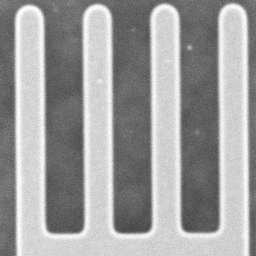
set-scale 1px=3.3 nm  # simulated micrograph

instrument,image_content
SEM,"groups of lines, slits or small figures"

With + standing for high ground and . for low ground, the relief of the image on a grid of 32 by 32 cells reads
................................
..+++......+++.....+++......+++.
..+++......+++.....+++.....++++.
..+++......+++.....+++.....++++.
..+++......+++.....+++.....++++.
..+++......+++.....+++.....++++.
..+++......+++.....+++.....++++.
..+++......+++.....+++......+++.
..+++......+++.....+++......+++.
..+++......+++.....+++......+++.
..+++......+++.....+++......+++.
..+++......+++.....+++......+++.
..+++......+++.....+++......+++.
..+++......+++.....+++......+++.
..+++......+++.....+++......+++.
..+++......+++.....+++......+++.
..+++......+++.....+++......+++.
..++++.....+++.....+++......+++.
..++++.....+++.....+++......+++.
..++++.....+++.....+++......+++.
..++++.....+++.....+++......+++.
..++++.....+++.....+++......+++.
..++++.....+++.....+++......+++.
..++++.....+++.....+++......+++.
..++++.....+++.....+++......+++.
..++++.....+++.....+++......+++.
..++++.....+++.....+++......+++.
..++++.....+++.....+++......+++.
..++++.....+++.....++++....++++.
..+++++++++++++++++++++++++++++.
..+++++++++++++++++++++++++++++.
..+++++++++++++++++++++++++++++.